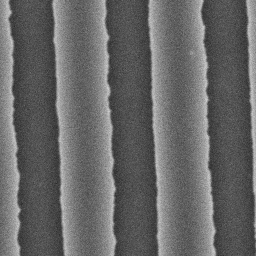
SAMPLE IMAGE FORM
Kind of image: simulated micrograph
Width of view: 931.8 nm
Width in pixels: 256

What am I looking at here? lines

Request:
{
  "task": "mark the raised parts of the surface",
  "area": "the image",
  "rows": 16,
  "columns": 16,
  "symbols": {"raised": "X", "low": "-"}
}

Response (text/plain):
X--XXXX--XXXX--X
X--XXXX--XXXX--X
X--XXXX--XXXX---
X--XXXX--XXXX---
X---XXX---XXX---
X---XXX---XXX---
X---XXX---XXX---
X---XXX---XXX---
X---XXX---XXX---
X---XXX---XXX---
X---XXX---XXX---
X---XXX---XXX---
X---XXX---XXX---
X---XXX---XXX---
X---XXX---XXX---
X---XXX---XXX---